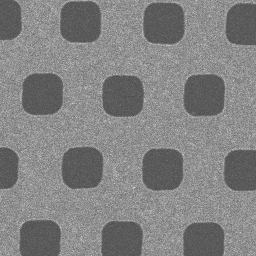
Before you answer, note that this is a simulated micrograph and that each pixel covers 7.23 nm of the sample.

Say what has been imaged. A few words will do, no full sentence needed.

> holes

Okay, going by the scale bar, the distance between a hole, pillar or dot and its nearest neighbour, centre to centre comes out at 582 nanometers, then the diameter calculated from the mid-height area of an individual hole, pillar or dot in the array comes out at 323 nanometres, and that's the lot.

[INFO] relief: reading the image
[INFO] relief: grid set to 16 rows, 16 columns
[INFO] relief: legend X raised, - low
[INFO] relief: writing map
-XXX--XXX--XXXX-
-XXX--XXX---XX--
XXXX--XXX--XXX--
XXXXXXXXXXXXXXXX
XXXXXXXXXXXXXXXX
X---XX---XXX--XX
X---XX---XXX--XX
XXXXXXXXXXXXXXXX
XXXXXXXXXXXXXXXX
-XXX--XXX--XXXX-
-XXX--XXX--XXX--
-XXX--XXX--XXX--
XXXXXXXXXXXXXXXX
XXXXXXXXXXXXXXXX
X---XX---XXX--XX
X---XX---XX---XX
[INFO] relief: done